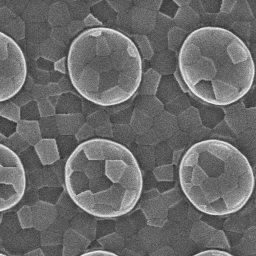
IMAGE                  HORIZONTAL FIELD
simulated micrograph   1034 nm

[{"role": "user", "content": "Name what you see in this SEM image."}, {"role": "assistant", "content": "raised bodies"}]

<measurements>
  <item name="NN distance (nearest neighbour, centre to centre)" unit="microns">0.453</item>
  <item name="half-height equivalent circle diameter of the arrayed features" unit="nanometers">300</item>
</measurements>